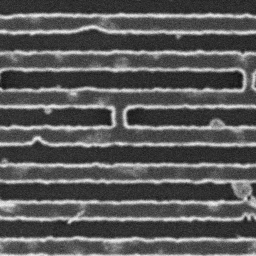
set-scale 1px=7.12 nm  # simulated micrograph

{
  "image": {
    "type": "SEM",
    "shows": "parallel lines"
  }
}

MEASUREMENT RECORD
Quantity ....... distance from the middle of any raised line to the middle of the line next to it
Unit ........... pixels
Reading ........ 37.4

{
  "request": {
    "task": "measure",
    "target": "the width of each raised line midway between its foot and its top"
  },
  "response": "120 nanometres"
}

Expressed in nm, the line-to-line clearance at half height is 145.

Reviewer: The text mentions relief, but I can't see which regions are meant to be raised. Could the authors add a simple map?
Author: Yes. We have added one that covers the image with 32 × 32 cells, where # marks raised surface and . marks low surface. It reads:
................................
................................
################################
###########.####################
................................
................................
..............#.................
################################
################################
..............................##
...............................#
################################
################################
.............###................
..............##................
..............##................
################################
################################
................................
................................
................................
################################
################################
..............................#.
..............................#.
################################
################################
........#.......................
................................
................................
################################
################################